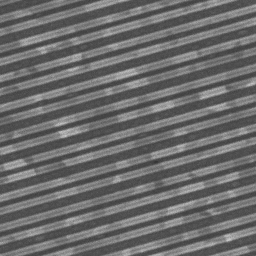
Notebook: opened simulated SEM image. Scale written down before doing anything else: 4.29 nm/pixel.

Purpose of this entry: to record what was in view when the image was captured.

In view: parallel lines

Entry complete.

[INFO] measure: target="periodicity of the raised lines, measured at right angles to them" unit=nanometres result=61.5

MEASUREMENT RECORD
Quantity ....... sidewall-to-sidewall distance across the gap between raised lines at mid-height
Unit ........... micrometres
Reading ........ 0.0335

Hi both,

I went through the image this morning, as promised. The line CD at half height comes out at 25.8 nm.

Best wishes